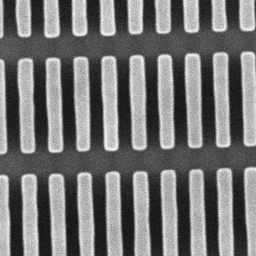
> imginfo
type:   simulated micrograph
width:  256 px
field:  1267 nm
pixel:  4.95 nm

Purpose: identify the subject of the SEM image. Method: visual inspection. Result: groups of lines, slits or small figures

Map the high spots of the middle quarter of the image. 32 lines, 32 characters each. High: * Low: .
...***...****....***....***....*
...***...****....***....***....*
...***...****....***....***....*
...***...****....***....***....*
...***...****....***....***....*
...***....***....***....***....*
...***....***....***....***....*
...***....***....***....***....*
...***....***....***....***....*
...***....***....***....***....*
...***....***....***....***....*
...***....***....***....***....*
...***....***....***....***....*
...***....***....***....***....*
...***....***....***....***....*
...***....***....***....***....*
...***....***....***....***....*
...***....***....***....****...*
...***....***....***....****...*
...***....***....***....****...*
...***....***....***....***....*
....**.....**...................
................................
................................
................................
................................
................................
....**.....***....***...****...*
....***....***...****...****...*
....***....***...****...****...*
....***....***...****...****...*
....***....***...****...****...*